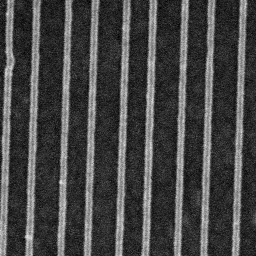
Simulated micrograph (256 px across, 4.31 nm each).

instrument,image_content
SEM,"parallel lines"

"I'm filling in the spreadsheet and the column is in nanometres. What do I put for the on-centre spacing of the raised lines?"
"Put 126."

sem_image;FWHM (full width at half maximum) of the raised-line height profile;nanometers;23.2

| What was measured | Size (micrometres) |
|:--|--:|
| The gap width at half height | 0.0932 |